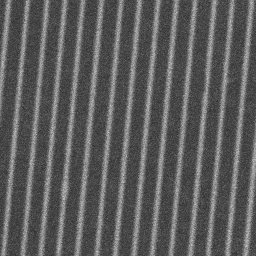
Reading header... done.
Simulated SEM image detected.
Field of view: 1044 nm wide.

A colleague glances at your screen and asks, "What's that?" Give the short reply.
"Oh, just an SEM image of parallel lines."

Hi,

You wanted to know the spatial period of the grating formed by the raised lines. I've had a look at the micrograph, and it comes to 75.9 nm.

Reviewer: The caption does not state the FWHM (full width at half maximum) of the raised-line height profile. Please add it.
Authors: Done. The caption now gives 14.7 nanometres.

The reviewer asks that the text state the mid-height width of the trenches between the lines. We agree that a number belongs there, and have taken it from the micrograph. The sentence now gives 59.4 nanometers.